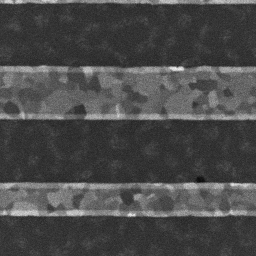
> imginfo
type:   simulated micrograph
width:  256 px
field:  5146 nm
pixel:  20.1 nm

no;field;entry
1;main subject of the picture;one or a few lines or trenches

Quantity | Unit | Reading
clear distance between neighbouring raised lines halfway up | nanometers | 1370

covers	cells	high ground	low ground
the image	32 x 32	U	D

DDDDDDDDDDDDDDDDDDDDDDDDDDDDDDDD
DDDDDDDDDDDDDDDDDDDDDDDDDDDDDDDD
DDDDDDDDDDDDDDDDDDDDDDDDDDDDDDDD
DDDDDDDDDDDDDDDDDDDDDDDDDDDDDDDD
DDDDDDDDDDDDDDDDDDDDDDDDDDDDDDDD
DDDDDDDDDDDDDDDDDDDDDDDDDDDDDDDD
DDDDDDDDDDDDDDDDDDDDDDDDDDDDDDDD
DDDDDDDDDDDDDDDDDDDDDDDDDDDDDDDD
DDDDDDDDDDDDDDDDDDDDDDDDDUDDDDDD
UUUUUUUUUUUUUUUUUUUUUUUUUUUUUUUU
UUUUUUUUUUUUUUUUUUUUUUUUUUUUUUUU
UUUUUUUUUUUUUUUUUUUUUUUUUUUUUUUU
UUUUUUUUUUUUUUUUUUUUUUUUUUUUUUUU
UUUUUUUUUUUUUUUUUUUUUUUUUUUUUUUU
UUUUUUUUUUUUUUUUUUUUUUUUUUUUUUUU
DDDDDDDDDDDDDDDDDDDDDDDDDDDDDDDD
DDDDDDDDDDDDDDDDDDDDDDDDDDDDDDDD
DDDDDDDDDDDDDDDDDDDDDDDDDDDDDDDD
DDDDDDDDDDDDDDDDDDDDDDDDDDDDDDDD
DDDDDDDDDDDDDDDDDDDDDDDDDDDDDDDD
DDDDDDDDDDDDDDDDDDDDDDDDDDDDDDDD
DDDDDDDDDDDDDDDDDDDDDDDDDDDDDDDD
DDDDDDDDDDDDDDDDDDDDDDDDDDDDDDDD
UUUUUUUUUUUUUUUUUUUUUUUUUUUUUUUU
UUUUUUUUUUUUUUUUUUUUUUUUUUUUUUUU
UUUUUUUUUUUUUUUUUUUUUUUUUUUUUUUU
UUUUUUUUUUUUUUUUUUUUUUUUUUUUUUUU
DDDDDDDDDDDDDDDDDDDDDDDDDDDDDDDD
DDDDDDDDDDDDDDDDDDDDDDDDDDDDDDDD
DDDDDDDDDDDDDDDDDDDDDDDDDDDDDDDD
DDDDDDDDDDDDDDDDDDDDDDDDDDDDDDDD
DDDDDDDDDDDDDDDDDDDDDDDDDDDDDDDD